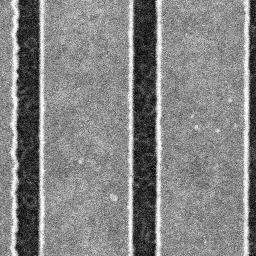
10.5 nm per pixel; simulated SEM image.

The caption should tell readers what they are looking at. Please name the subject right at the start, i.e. one or a few lines or trenches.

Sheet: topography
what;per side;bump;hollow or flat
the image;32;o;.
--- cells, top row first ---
oo...ooooooooooo....ooooooooooo.
oo...ooooooooooo....ooooooooooo.
oo...ooooooooooo....ooooooooooo.
oo...ooooooooooo....ooooooooooo.
oo...ooooooooooo....ooooooooooo.
oo...ooooooooooo....ooooooooooo.
oo...ooooooooooo....ooooooooooo.
oo...ooooooooooo....ooooooooooo.
oo...ooooooooooo....ooooooooooo.
oo...ooooooooooo....ooooooooooo.
oo...ooooooooooo....ooooooooooo.
oo...ooooooooooo....ooooooooooo.
oo...ooooooooooo....ooooooooooo.
oo...ooooooooooo....ooooooooooo.
oo...ooooooooooo....ooooooooooo.
oo...ooooooooooo....ooooooooooo.
oo...ooooooooooo....ooooooooooo.
oo...ooooooooooo....ooooooooooo.
oo...ooooooooooo....ooooooooooo.
oo...ooooooooooo....ooooooooooo.
oo...ooooooooooo....ooooooooooo.
oo...ooooooooooo....ooooooooooo.
oo...ooooooooooo....ooooooooooo.
oo...ooooooooooo....ooooooooooo.
oo...ooooooooooo....ooooooooooo.
oo...ooooooooooo....ooooooooooo.
oo...ooooooooooo....ooooooooooo.
oo...ooooooooooo....ooooooooooo.
oo...ooooooooooo....ooooooooooo.
oo...ooooooooooo....ooooooooooo.
oo...ooooooooooo....ooooooooooo.
oo...ooooooooooo....ooooooooooo.